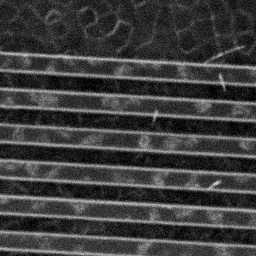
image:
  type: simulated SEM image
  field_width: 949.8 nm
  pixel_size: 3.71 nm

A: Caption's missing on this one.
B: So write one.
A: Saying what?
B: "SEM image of parallel lines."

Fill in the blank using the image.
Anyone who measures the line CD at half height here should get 64.3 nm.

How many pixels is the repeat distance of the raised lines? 35.6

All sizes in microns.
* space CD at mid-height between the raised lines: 0.0671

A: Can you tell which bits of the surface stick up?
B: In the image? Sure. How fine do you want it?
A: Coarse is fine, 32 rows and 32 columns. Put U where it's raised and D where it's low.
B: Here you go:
DDDDDDDDDDDDDDDDDDDDDDDDDDDDDDDD
DDDDDDDDDDDDDDDDDDDDDDDDDDDDDDDD
DDDDDDDDDDDDDDDDDDDDDDDDDDDDDDDD
DDDDDDDDDDDDDDDDDDDDDDDDDDDDDDDD
DDDDDDDDDDDDDDDDDDDDDDDDDDDDDDDD
DDDDDDDDDDDDDDDDDDDDDDDDDDDDDDDD
DDDDDDDDDDDDDDDDDDDDDDDDDDDDDDDD
UUUUUUUUUUUUUUUDDDDDDDDDDDDDDDDD
UUUUUUUUUUUUUUUUUUUUUUUUUUUUUUUU
DDDDDDDDDDDDUUUUUUUUUUUUUUUUUUUU
DDDDDDDDDDDDDDDDDDDDDDDDDDDDUDUU
UUUUUUUDDDDDDDDDDDDDDDDDDDDDDDDD
UUUUUUUUUUUUUUUUUUUUUUUUDDDDDDDD
DUDDUUUUUUUUUUUUUUUUUUUUUUUUUUUU
DDDDDDDDDDDDDDDDDDDUUUUUUUUUUUUU
DDDDDDDDDDDDDDDDDDDDDDDDDDDDDDDD
UUUUUUUUUUUUUUUUDDDDDDDDDDDDDDDD
UUUUUUUUUUUUUUUUUUUUUUUUUUUUUUUU
DDDDDDDDDDDDDUUUUUUUUUUUUUUUUUUU
DDDDDDDDDDDDDDDDDDDDDDDDDDDDDDUU
UUUUUUUUUDDDDDDDDDDDDDDDDDDDDDDD
UUUUUUUUUUUUUUUUUUUUUUUUUUDDDDDD
DDDDDUUUUUUUUUUUUUUUUUUUUUUUUUUU
DDDDDDDDDDDDDDDDDDDDDDUUUUUUUUUU
UDDDDDDDDDDDDDDDDDDDDDDDDDDDDDDD
UUUUUUUUUUUUUUUUUUDDDDDDDDDDDDDD
UUUUUUUUUUUUUUUUUUUUUUUUUUUUUUUU
DDDDDDDDDDDDDDDUUUUUUUUUUUUUUUUU
DDDDDDDDDDDDDDDDDDDDDDDDDDDDDDDD
UUUUUUUUUDDDDDDDDDDDDDDDDDDDDDDD
UUUUUUUUUUUUUUUUUUUUUUUUUUDDDDDD
DDDDDDDUUUUUUUUUUUUUUUUUUUUUUUUU